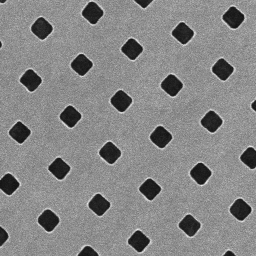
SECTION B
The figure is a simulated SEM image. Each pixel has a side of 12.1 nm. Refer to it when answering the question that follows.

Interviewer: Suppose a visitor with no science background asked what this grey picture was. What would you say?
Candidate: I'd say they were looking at a regular array of holes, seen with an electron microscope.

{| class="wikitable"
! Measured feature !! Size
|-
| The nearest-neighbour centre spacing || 639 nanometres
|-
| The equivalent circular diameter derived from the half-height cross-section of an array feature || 0.244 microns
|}